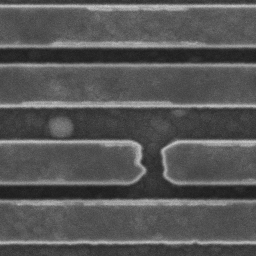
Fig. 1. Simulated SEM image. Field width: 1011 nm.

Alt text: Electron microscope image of one or a few lines or trenches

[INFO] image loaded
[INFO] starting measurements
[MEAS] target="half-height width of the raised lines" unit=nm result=166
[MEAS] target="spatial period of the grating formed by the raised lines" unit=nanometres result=258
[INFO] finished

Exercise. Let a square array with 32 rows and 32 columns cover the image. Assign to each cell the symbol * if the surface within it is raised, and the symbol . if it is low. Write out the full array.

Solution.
................................
********************************
********************************
********************************
********************************
********************************
................................
................................
********************************
********************************
********************************
********************************
********************************
................................
................................
................................
................................
................................
*****************....***********
******************..************
******************..************
******************...***********
*****************....***********
................................
................................
********************************
********************************
********************************
********************************
********************************
................................
................................